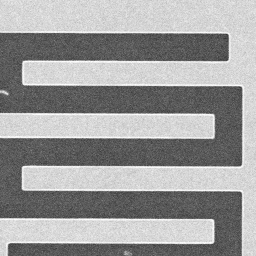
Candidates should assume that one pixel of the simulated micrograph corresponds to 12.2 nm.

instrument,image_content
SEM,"groups of lines, slits or small figures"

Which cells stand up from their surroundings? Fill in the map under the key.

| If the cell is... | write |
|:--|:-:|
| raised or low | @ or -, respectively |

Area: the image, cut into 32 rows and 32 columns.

@@@@@@@@@@@@@@@@@@@@@@@@@@@@@@@@
@@@@@@@@@@@@@@@@@@@@@@@@@@@@@@@@
@@@@@@@@@@@@@@@@@@@@@@@@@@@@@@@@
@@@@@@@@@@@@@@@@@@@@@@@@@@@@@@@@
-----------------------------@@@
-----------------------------@@@
-----------------------------@@@
----------------------------@@@@
---@@@@@@@@@@@@@@@@@@@@@@@@@@@@@
---@@@@@@@@@@@@@@@@@@@@@@@@@@@@@
---@@@@@@@@@@@@@@@@@@@@@@@@@@@@@
------------------------------@@
------------------------------@@
------------------------------@@
@@@@@@@@@@@@@@@@@@@@@@@@@@@---@@
@@@@@@@@@@@@@@@@@@@@@@@@@@@---@@
@@@@@@@@@@@@@@@@@@@@@@@@@@@---@@
------------------------------@@
------------------------------@@
------------------------------@@
------------------------------@@
---@@@@@@@@@@@@@@@@@@@@@@@@@@@@@
---@@@@@@@@@@@@@@@@@@@@@@@@@@@@@
---@@@@@@@@@@@@@@@@@@@@@@@@@@@@@
------------------------------@@
------------------------------@@
------------------------------@@
@@@@@@@@@@@@@@@@@@@@@---------@@
@@@@@@@@@@@@@@@@@@@@@@@@@@@---@@
@@@@@@@@@@@@@@@@@@@@@@@@@@@---@@
@-----------------------------@@
@-----------------------------@@